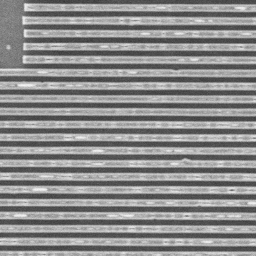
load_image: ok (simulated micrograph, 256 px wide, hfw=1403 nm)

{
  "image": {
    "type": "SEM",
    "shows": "parallel lines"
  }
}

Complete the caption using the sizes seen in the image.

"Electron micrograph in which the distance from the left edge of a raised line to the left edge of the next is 13 pixels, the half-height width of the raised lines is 37.7 nm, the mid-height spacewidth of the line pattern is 33.6 nanometres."